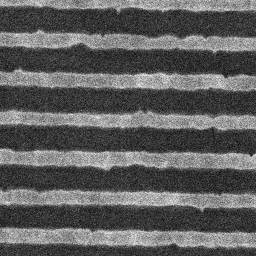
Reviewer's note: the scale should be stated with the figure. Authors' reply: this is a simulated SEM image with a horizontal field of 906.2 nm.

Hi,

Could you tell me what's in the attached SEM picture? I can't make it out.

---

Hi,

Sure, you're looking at parallel lines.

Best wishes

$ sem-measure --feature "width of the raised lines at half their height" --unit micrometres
0.0562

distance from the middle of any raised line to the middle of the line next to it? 139 nm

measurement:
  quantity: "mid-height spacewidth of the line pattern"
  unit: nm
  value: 84.5